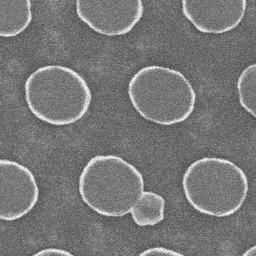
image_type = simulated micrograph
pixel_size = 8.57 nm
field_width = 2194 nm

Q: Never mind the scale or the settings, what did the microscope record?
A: raised bodies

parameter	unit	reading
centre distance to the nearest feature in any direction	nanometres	863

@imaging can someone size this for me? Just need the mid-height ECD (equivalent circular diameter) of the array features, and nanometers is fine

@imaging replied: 513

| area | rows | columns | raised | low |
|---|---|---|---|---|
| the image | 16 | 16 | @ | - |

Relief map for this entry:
@@---@@@@---@@@-
@@----@@----@@@-
----------------
----------------
--@@-----@@----@
--@@@---@@@@---@
--@@@---@@@@---@
---@@----@@-----
----------------
----------------
@----@@@----@@@-
@@---@@@@---@@@-
@@---@@@@@--@@@-
@-------@@------
----------------
----------------